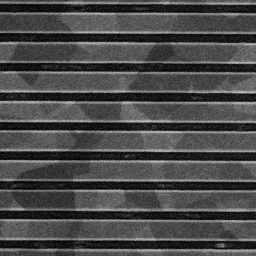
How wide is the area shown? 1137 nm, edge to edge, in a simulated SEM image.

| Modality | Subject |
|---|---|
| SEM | parallel lines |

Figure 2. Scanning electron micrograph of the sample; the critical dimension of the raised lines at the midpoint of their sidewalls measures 84.4 nm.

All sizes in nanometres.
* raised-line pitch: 131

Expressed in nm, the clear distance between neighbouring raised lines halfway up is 44.4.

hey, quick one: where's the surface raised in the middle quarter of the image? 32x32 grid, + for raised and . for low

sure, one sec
................................
................................
++++++++++++++++++++++++++++++++
++++++++++++++++++++++++++++++++
++++++++++++++++++++++++++++++++
++++++++++++++++++++++++++++++++
++++++++++++++++++++++++++++++++
................................
................................
................................
++++++++++++++++++++++++++++++++
++++++++++++++++++++++++++++++++
++++++++++++++++++++++++++++++++
++++++++++++++++++++++++++++++++
................................
................................
................................
++++++++++++++++++++++++++++++++
++++++++++++++++++++++++++++++++
++++++++++++++++++++++++++++++++
++++++++++++++++++++++++++++++++
...........+++++++++++++++++++++
................................
................................
++++++++++++.........+....+.....
++++++++++++++++++++++++++++++++
++++++++++++++++++++++++++++++++
++++++++++++++++++++++++++++++++
++++++++++++++++++++++++++++++++
................................
................................
................................